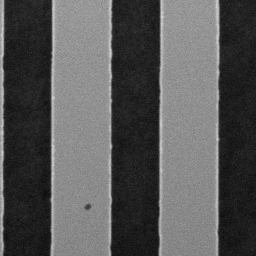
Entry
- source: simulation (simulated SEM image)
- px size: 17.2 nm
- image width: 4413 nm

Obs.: lines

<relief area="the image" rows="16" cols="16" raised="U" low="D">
DDDUUUUDDDUUUUDD
DDDUUUUDDDUUUUDD
DDDUUUUDDDUUUUDD
DDDUUUUDDDUUUUDD
DDDUUUUDDDUUUUDD
DDDUUUUDDDUUUUDD
DDDUUUUDDDUUUUDD
DDDUUUUDDDUUUUDD
DDDUUUUDDDUUUUDD
DDDUUUUDDDUUUUDD
DDDUUUUDDDUUUUDD
DDDUUUUDDDUUUUDD
DDDUUUUDDDUUUUDD
DDDUUUUDDDUUUUDD
DDDUUUUDDDUUUUDD
DDDUUUUDDDUUUUDD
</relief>